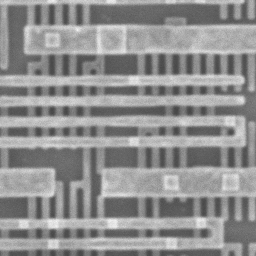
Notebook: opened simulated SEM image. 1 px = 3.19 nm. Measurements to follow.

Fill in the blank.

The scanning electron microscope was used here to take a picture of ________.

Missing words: wiring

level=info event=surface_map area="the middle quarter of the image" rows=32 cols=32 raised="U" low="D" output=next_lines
DDDDDDDDDDDDDDDDDDDDDDDDDDDDDDDD
DDDDDDDDDDDDDDDDDDDDDDDDDDDDDDDD
DDDDDDDDDDDDDDDDDDDDDDDDDDDDDDDD
UUUUUUUUUUUUUUUUUUUUUUUUUUUUUUUU
UUUUUUUUUUUUUUUUUUUUUUUUUUUUUUUU
DDDDDDDDDDDDDDDDDDDDDDDDDDDDDDDD
DDDDDDDDDDDDDDDDDDDDDDDDDDDDDDDD
DDDDDDDDDDDDDDDDDDDDDDDDDDDDDDDD
UUUUUUUUUUUUUUUUUUUUUUUUUUUUUUUU
UUUUUUUUUUUUUUUUUUUUUUUUUUUUUUUU
DDDDDDDDDDDDDDDDDDDDDDDDDDDDDDDD
DDDDDDDDDDDDDDDDDDDDDDDDDDDDDDDD
DDDDDDDDDDDDDDDDDDDDDDDDDDDDDDDD
UUUUUUUUUUUUUUUUUUUUUUUUUUUUUUUU
UUUUUUUUUUUUUUUUUUUUUUUUUUUUUUUU
UUUUUUDDDDDDDDDUUUUUUUUUUUUUUUDD
DDDDDDDDDDDDDDDDDDDDDDDDDDDDDDDD
DDDDDDDDDDDDDDDDDDDDDDDDDDDDDDDD
UUUUUUUUUUUUUUUUUUUUUUUUUUUUUUUU
UUUUUUUUUUUUUUUUUUUUUUUUUUUUUUUU
UUUUUUUUUUUUUUUUDUUUUUUUUUUUUUUU
DDDDDDDDDDDDDDDDDDDDDDDDDDDDDDDD
DDDDDDDDDDDDDDDDDDDDDDDDDDDDDDDD
DDDDDDDDDDDDDDDDDDDDDDDDDDDDDDDD
DDDDDDDDDDDDDDDDDDDDDDDDDDDDDDDD
DDDDDDDDDDDDDDDDDDDDDDDDDDDDDDDD
DDDDDDDDDDUUUUUUUUUUUUUUUUUUUUUU
DDDDDDDDDDUUUUUUUUUUUUUUUUUUUUUU
DDDDDDDDDDUUUUUUUUUUUUUUUUUUUUUU
DDDDDDDDDUUUUUUUUUUUUUUUUUUUUUUU
DDDDDDDDDUUUUUUUUUUUUUUUUUUUUUUU
DDDDDDDDDUUUUUUUUUUUUUUUUUUUUUUU